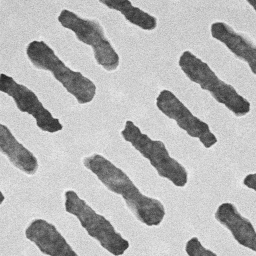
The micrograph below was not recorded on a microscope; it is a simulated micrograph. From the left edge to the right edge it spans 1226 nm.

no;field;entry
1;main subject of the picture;holes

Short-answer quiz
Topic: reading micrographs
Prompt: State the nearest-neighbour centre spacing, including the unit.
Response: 213 nm